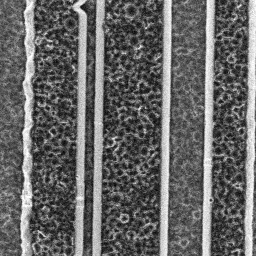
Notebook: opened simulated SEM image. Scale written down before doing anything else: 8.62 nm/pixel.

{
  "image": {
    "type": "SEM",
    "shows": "one or a few lines or trenches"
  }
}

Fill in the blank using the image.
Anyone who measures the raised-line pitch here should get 755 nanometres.